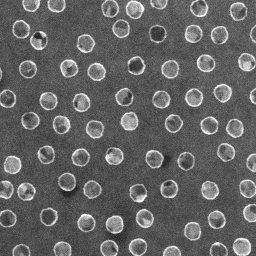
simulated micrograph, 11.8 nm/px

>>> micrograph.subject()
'a regular array of raised bodies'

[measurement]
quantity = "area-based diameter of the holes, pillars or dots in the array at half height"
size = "202 nanometers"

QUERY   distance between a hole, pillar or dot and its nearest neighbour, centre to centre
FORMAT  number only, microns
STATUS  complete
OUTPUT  0.326